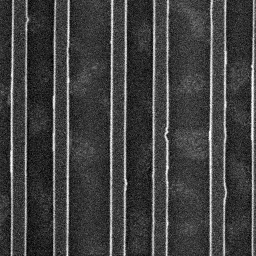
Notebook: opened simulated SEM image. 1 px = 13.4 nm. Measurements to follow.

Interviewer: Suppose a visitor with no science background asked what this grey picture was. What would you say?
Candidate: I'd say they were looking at parallel lines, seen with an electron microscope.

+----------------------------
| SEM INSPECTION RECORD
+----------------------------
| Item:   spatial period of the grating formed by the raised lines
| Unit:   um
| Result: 0.665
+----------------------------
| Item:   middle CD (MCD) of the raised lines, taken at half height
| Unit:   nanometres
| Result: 192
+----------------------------